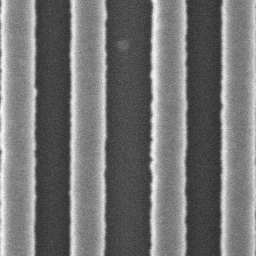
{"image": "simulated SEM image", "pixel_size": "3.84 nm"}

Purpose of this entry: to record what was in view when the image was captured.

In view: lines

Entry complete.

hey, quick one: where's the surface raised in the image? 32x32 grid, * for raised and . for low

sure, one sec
****.....****......****.....****
****.....****......****.....****
****.....****......****.....****
****.....****......****.....****
****.....****......****.....****
****.....****......****.....****
****.....****......****.....****
****.....****......****.....****
****.....****......****.....****
****.....****......****.....****
****.....****......****.....****
*****....****......****.....****
****.....****......****.....****
****.....****......****.....****
****.....****......****.....****
****.....****......****.....****
****.....****......****.....****
****.....****......****.....****
****.....****......****.....****
****.....****......****.....****
****.....****......****.....****
****.....****......****.....****
****.....****......****.....****
****.....****......****.....****
****.....****......****.....****
****.....****......****.....****
****.....****......****.....****
****.....****......****.....****
****.....****......****.....****
****.....****......****.....****
****.....****......****.....****
****.....****......****.....****